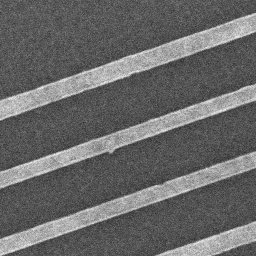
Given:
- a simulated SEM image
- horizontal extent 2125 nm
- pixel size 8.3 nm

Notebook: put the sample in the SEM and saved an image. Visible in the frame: one or a few lines or trenches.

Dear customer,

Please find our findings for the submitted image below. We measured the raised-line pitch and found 0.539 micrometres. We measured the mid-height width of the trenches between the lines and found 0.416 um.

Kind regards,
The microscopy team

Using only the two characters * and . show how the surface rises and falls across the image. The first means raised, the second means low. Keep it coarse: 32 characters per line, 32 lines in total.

................................
................................
.............................***
...........................*****
........................******..
.....................******.....
..................*******.......
...............******...........
............*******.............
.........*******................
.......******...................
....******...................***
.******...................******
****....................*****...
*....................*****......
..................*****.........
...............*****............
............*****...............
.........******.................
......*****...................**
...******...................****
******...................*****..
***...................*****.....
...................*****........
................*****...........
.............******.............
..........******................
.......******...................
....******....................**
.******....................*****
****....................******..
*....................*******....